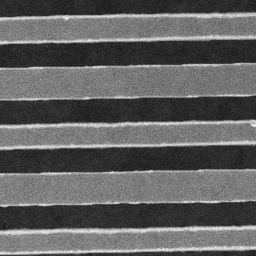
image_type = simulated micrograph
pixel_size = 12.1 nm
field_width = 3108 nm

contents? lines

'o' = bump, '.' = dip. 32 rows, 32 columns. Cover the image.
................................
................................
oooooooooooooooooooooooooooooooo
oooooooooooooooooooooooooooooooo
oooooooooooooooooooooooooooooooo
o...............................
................................
................................
...ooooooooooooooooooooooooooooo
oooooooooooooooooooooooooooooooo
oooooooooooooooooooooooooooooooo
oooooooooooooooooooooooooooooooo
................................
................................
................................
.......ooooooooooooooooooooooooo
oooooooooooooooooooooooooooooooo
oooooooooooooooooooooooooooooooo
ooooooo.........................
................................
................................
................oooooooooooooooo
oooooooooooooooooooooooooooooooo
oooooooooooooooooooooooooooooooo
oooooooooooooooooooooooooooooooo
oooooooooooo....................
................................
................................
..................oooooooooooooo
oooooooooooooooooooooooooooooooo
oooooooooooooooooooooooooooooooo
ooooooooooooooooo...............